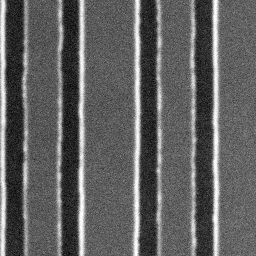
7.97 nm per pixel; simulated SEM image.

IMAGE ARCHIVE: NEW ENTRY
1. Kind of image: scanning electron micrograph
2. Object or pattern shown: lines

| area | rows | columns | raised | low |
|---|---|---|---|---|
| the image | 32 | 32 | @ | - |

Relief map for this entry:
---@@@@@--@@@@@@@---@@@@---@@@@@
---@@@@@--@@@@@@@---@@@@---@@@@@
---@@@@@--@@@@@@@---@@@@---@@@@@
---@@@@@--@@@@@@@---@@@@---@@@@@
---@@@@@--@@@@@@@---@@@@---@@@@@
---@@@@@--@@@@@@@---@@@@---@@@@@
---@@@@@--@@@@@@@---@@@@---@@@@@
---@@@@---@@@@@@@---@@@@---@@@@@
---@@@@---@@@@@@@---@@@@---@@@@@
---@@@@@--@@@@@@@---@@@@---@@@@@
---@@@@@--@@@@@@@---@@@@---@@@@@
---@@@@@--@@@@@@@---@@@@---@@@@@
---@@@@@--@@@@@@@---@@@@---@@@@@
---@@@@@--@@@@@@@---@@@@---@@@@@
---@@@@@--@@@@@@@---@@@@---@@@@@
---@@@@@--@@@@@@@---@@@@---@@@@@
---@@@@@--@@@@@@@---@@@@---@@@@@
---@@@@@--@@@@@@@---@@@@---@@@@@
---@@@@---@@@@@@@---@@@@---@@@@@
---@@@@---@@@@@@@---@@@@---@@@@@
---@@@@---@@@@@@@---@@@@---@@@@@
---@@@@---@@@@@@@---@@@@---@@@@@
---@@@@---@@@@@@@---@@@@---@@@@@
---@@@@---@@@@@@@---@@@@---@@@@@
@--@@@@---@@@@@@@---@@@@---@@@@@
---@@@@---@@@@@@@---@@@@---@@@@@
---@@@@---@@@@@@@---@@@@---@@@@@
---@@@@---@@@@@@@---@@@@---@@@@@
---@@@@---@@@@@@@---@@@@---@@@@@
---@@@@---@@@@@@@---@@@@---@@@@@
---@@@@---@@@@@@@---@@@@---@@@@@
---@@@@---@@@@@@@---@@@@---@@@@@